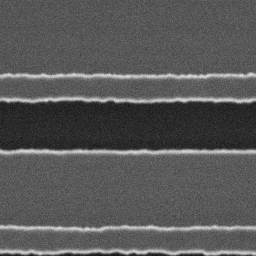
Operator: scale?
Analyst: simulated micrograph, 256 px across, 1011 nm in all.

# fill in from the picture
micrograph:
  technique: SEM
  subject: lines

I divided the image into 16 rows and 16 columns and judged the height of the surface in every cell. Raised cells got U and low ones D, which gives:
UUUUUUUUUUUUUUUU
UUUUUUUUUUUUUUUU
UUUUUUUUUUUUUUUU
UUUUUUUUUUUUUUUU
UUUUUUUUUUUUUUUU
UUUUUUUUUUUUUUUU
DDDDDDDDDDDDDDDD
DDDDDDDDDDDDDDDD
DDDDDDDDDDDDDDDD
UUUUUUUUUUUUUUUU
UUUUUUUUUUUUUUUU
UUUUUUUUUUUUUUUU
UUUUUUUUUUUUUUUU
UUUUUUUUUUUUUUUU
UUUUUUUUUUUUUUUU
UUUUUUUUUUUUUUUU